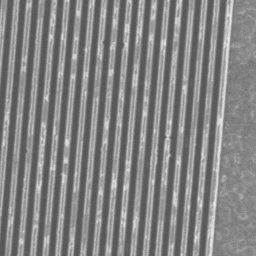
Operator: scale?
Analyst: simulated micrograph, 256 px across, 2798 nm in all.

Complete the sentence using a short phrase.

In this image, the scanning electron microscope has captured parallel lines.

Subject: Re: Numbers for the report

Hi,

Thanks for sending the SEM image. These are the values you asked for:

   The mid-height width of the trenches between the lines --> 0.0721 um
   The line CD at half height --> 61.3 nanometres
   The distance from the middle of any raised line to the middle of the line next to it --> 136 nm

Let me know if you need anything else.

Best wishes